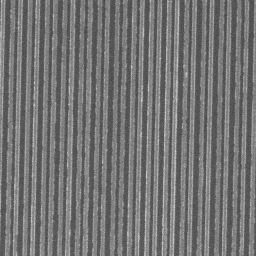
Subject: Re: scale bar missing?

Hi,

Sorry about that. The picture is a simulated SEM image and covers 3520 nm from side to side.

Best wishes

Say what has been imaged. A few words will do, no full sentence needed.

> parallel lines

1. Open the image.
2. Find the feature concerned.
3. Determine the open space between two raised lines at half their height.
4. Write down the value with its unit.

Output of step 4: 82.5 nm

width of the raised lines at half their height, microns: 0.0481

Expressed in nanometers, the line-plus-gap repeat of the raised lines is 120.